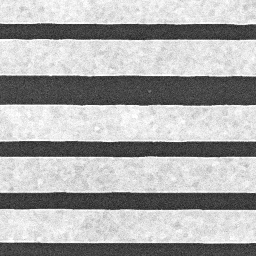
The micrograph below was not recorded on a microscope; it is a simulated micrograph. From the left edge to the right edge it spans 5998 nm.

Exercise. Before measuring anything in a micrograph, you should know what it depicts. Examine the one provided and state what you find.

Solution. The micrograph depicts wiring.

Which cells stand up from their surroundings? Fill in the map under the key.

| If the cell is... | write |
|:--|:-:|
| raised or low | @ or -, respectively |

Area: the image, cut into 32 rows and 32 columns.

@@@@@@@@@@@@@@@@@@@@@@@@@@@@@@@@
@@@@@@@@@@@@@@@@@@@@@@@@@@@@@@@@
@@@@@@@@@@@@@@@@@@@@@@@@@@@@@@@@
--------------------------------
--------------------------------
@@@@@@@@@@@@@@@@@@@@@@@@@@@@@@@@
@@@@@@@@@@@@@@@@@@@@@@@@@@@@@@@@
@@@@@@@@@@@@@@@@@@@@@@@@@@@@@@@@
@@@@@@@@@@@@@@@@@@@@@@@@@@@@@@@@
--------------------------------
--------------------------------
--------------------------------
--------------------------------
@@@@@@@@@@@@@@@@@@@@@@@@@@@@@@@@
@@@@@@@@@@@@@@@@@@@@@@@@@@@@@@@@
@@@@@@@@@@@@@@@@@@@@@@@@@@@@@@@@
@@@@@@@@@@@@@@@@@@@@@@@@@@@@@@@@
@@@---@@@@@@@@@@@@@@@@@@@@@@@@@@
--------------------------------
--------------------------------
@@@@@@@@@@@@@@@@@@@@@@@@@@@@@@@@
@@@@@@@@@@@@@@@@@@@@@@@@@@@@@@@@
@@@@@@@@@@@@@@@@@@@@@@@@@@@@@@@@
@@@@@@@@@@@@@@@@@@@@@@@@@@@@@@@@
--------------------------------
--------------------------------
@@@@@@@@@@@@@@@@@@@@@@@@@@@@@@@@
@@@@@@@@@@@@@@@@@@@@@@@@@@@@@@@@
@@@@@@@@@@@@@@@@@@@@@@@@@@@@@@@@
@@@@@@@@@@@@@@@@@@@@@@@@@@@@@@@@
--------------------------------
--------------------------------